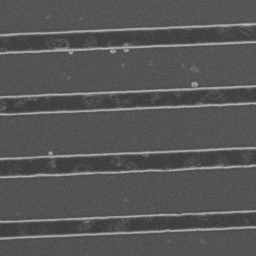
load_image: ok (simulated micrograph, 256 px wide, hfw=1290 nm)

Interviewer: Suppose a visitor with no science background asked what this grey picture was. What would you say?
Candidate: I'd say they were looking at one or a few lines or trenches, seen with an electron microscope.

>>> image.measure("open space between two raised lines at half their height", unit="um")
0.222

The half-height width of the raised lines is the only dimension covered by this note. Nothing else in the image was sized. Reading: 91.8 nm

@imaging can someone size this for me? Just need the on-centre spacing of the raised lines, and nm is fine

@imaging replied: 312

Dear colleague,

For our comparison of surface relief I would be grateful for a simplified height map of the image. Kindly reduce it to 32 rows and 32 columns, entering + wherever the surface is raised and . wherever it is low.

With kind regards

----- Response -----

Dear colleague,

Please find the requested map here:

................................
................................
................................
.....................+++++++++++
++++++++++++++++++++++++++++++++
+++++++++++++++++++++++++++.....
++++............................
................................
................................
................................
................................
...............+++++++++++++++++
++++++++++++++++++++++++++++++++
+++++++++++++++++++.............
................................
................................
................................
................................
................................
.......+.+++++++++++++++++++++++
++++++++++++++++++++++++++++++++
++++++++++++++++................
................................
................................
................................
................................
.............................+++
......++++++++++++++++++++++++++
++++++++++++++++++++++++++++++..
+++++++.........................
................................
................................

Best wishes